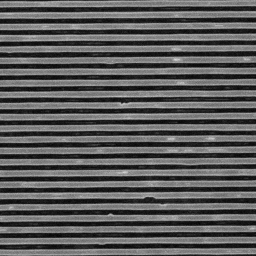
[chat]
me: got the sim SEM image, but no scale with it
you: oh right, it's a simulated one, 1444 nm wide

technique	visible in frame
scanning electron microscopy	parallel lines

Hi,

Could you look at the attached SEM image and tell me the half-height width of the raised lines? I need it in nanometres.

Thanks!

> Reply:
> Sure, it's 34.5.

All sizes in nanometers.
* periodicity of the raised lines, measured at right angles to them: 63.6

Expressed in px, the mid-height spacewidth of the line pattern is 5.25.